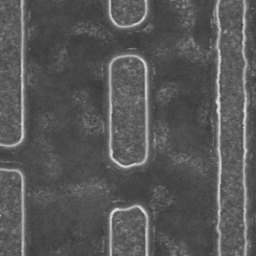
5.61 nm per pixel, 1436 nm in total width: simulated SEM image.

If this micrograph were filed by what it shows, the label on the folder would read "one or a few lines or trenches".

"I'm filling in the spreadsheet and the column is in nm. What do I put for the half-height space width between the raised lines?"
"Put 426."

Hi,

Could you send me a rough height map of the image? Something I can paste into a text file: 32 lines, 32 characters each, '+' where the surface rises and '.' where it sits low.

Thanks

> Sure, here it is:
+++...........++++.........++++.
+++...........++++.........++++.
+++...........++++.........++++.
+++........................++++.
+++........................++++.
+++........................+++..
+++........................+++..
+++...........++++.........++++.
+++...........++++.........++++.
+++...........++++.........+++..
+++...........++++.........+++..
+++...........++++.........++++.
+++...........++++.........++++.
+++...........++++.........++++.
+++...........++++.........++++.
+++...........++++.........++++.
+++...........++++.........++++.
+++...........++++.........++++.
..............++++.........++++.
..............++++.........++++.
...............++..........++++.
++.........................++++.
+++........................++++.
+++........................++++.
+++........................++++.
+++........................++++.
+++...........++++.........++++.
+++...........++++.........++++.
+++...........++++.........++++.
+++...........++++.........++++.
+++...........++++.........++++.
+++...........++++.........++++.